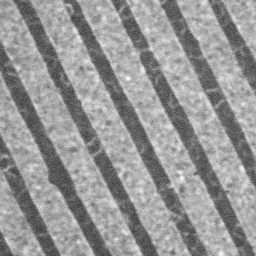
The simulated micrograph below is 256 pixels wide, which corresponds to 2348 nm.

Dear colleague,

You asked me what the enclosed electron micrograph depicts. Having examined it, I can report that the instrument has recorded parallel lines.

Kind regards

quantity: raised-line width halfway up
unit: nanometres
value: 248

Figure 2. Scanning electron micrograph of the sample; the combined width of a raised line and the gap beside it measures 399 nm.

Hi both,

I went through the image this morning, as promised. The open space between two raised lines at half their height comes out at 0.149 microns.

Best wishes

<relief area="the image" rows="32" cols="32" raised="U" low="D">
UUDDUUUUDDUUUUDDUUUUDDUUUUDDUUUU
UUDDDUUUDDUUUUUDDUUUDDDUUUUDDUUU
UUUDDUUUUDDUUUUDDUUUUDDUUUUDDUUU
UUUDDDUUUDDUUUUDDDUUUUDDUUUUDDUU
UUUUDDUUUUDDUUUUDDUUUUDDUUUUDDUU
UUUUDDDUUUDDUUUUDDDUUUDDDUUUUDDU
DUUUUDDUUUUDDUUUUDDUUUUDDUUUUDDD
DUUUUDDUUUUDDDUUUDDDUUUUDDUUUUDD
DDUUUUDDUUUUDDUUUUDDUUUUDDUUUUDD
DDUUUUDDDUUUDDDUUUDDDUUUUDDUUUUD
DDDUUUUDDUUUUDDUUUUDDUUUUDDUUUUD
UDDUUUUDDUUUUDDDUUUDDDUUUDDDUUUU
UUDDUUUUDDUUUUDDUUUUDDUUUUDDUUUU
UUDDUUUUDDUUUUDDDUUUDDDUUUDDDUUU
UUUDDUUUUDDUUUUDDUUUUDDUUUUDDUUU
UUUDDUUUUDDDUUUDDDUUUDDDUUUUUUUU
UUUUDDUUUUDDUUUUDDUUUUDDUUUUDDUU
UUUUDDUUUUDDUUUUDDDUUUDDDUUUUDDU
DUUUUDDUUUUDDUUUUDDUUUUDDUUUUDDU
DDUUUDDUUUUDDDUUUDDDUUUUDDUUUUDD
DDUUUUDDUUUUDDUUUUDDUUUUDDUUUUDD
DDDUUUDDDUUUDDDUUUDDDUUUDDDUUUUD
UDDUUUDDDUUUUDDUUUUDDUUUUDDUUUUD
UDDUUUUDDDUUUDDDUUUDDDUUUUDDUUUU
UUDDUUUUDDUUUUDDUUUUDDUUUUDDDUUU
UUDDUUUUDDDUUUDDDUUUDDDUUUUDDUUU
UUUDDUUUUDDUUUUDDUUUUDDUUUUDDUUU
UUUDDUUUUDDDUUUUDDUUUDDDUUUUDDUU
UUUUDDUUUUDDUUUUDDUUUUDDUUUUDDUU
UUUUDDUUUUDDUUUUDDDUUUDDDUUUUDDU
DUUUUDDUUUUDDUUUUDDUUUUDDUUUUDDU
DDUUUDDUUUUDDDUUUUDDUUUUDDUUUUDD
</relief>